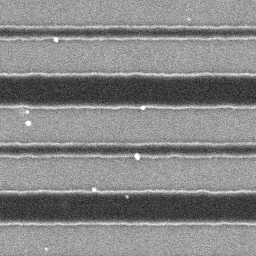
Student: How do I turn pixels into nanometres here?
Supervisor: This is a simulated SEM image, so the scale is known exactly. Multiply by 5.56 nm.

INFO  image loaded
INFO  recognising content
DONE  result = lines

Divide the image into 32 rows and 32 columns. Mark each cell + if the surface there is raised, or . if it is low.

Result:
................................
................................
................................
++++++++++++++++++++++++++++++++
++++++++++++++++++++++++++++++++
................................
................................
................................
................................
++++++++++++++++++++++++++++++++
++++++++++++++++++++++++++++++++
++++++++++++++++++++++++++++++++
++++++++++++++++++++++++++++++++
......+.......+..+...++.........
................................
................................
................................
................................
++++++++++++++++++++++++++++++++
++++++++++++++++++++++++++++++++
................................
................................
................................
................................
++++++++++++++++++++++++++++++++
++++++++++++++++++++++++++++++++
++++++++++++++++++++++++++++++++
++++++++++++++++++++++++++++++++
................................
................................
................................
................................